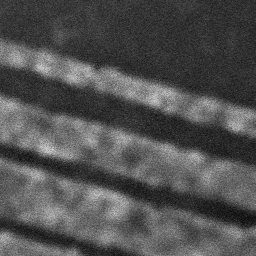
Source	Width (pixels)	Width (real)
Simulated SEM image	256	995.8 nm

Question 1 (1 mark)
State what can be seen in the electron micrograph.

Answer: one or a few lines or trenches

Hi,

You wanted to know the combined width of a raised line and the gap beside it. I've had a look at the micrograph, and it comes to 0.251 um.